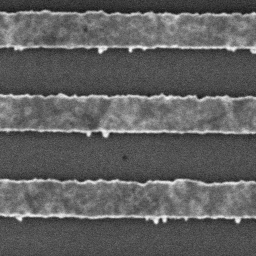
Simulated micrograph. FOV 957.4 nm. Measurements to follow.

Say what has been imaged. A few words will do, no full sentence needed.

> lines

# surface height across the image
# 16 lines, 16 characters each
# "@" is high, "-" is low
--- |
----------------
@@@@@@@@@@@@@@@@
@@@@@@@@@@@@@@@@
----------------
----------------
----------------
@@@@@@@@@@@@@@@@
@@@@@@@@@@@@@@@@
----------------
----------------
----------------
@@@@@@@@@@@@@@@@
@@@@@@@@@@@@@@@@
-@@@@@@@@@@@@@@@
----------------
----------------